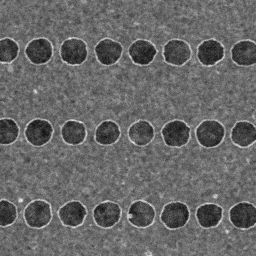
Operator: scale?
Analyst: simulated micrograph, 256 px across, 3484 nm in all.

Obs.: a regular array of holes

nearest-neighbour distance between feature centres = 462 nm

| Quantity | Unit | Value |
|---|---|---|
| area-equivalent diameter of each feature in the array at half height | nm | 366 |